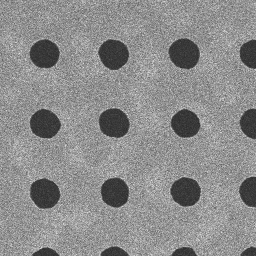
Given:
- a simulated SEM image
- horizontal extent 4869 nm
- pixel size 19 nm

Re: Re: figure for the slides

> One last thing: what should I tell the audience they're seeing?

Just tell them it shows a regular array of holes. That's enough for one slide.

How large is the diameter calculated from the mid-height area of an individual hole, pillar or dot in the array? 564 nm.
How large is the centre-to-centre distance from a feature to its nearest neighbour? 1.31 microns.